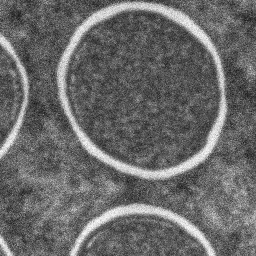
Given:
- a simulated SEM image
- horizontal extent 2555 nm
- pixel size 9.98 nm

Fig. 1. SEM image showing raised bodies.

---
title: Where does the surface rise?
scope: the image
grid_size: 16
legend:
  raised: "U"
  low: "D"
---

DDDDDDDUUUDDDDDD
DDDDDDUUUUUUDDDD
DDDDDUUUUUUUUDDD
UDDDUUUUUUUUUUDD
UDDDUUUUUUUUUUDD
UUDDUUUUUUUUUUDD
UUDDUUUUUUUUUUDD
UDDDDUUUUUUUUUDD
UDDDDUUUUUUUUDDD
DDDDDDUUUUUUUDDD
DDDDDDDDUUUDDDDD
DDDDDDDDDDDDDDDD
DDDDDDDDDDDDDDDD
DDDDDDDUUUUDDDDD
DDDDDUUUUUUUDDDD
DDDDDUUUUUUUUDDD